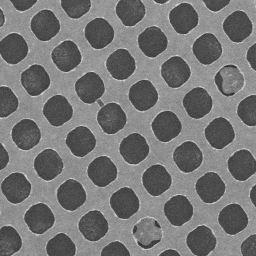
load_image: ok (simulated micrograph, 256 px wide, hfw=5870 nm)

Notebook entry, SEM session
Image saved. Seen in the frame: a regular array of holes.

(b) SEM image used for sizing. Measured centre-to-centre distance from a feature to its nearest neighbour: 869 nanometers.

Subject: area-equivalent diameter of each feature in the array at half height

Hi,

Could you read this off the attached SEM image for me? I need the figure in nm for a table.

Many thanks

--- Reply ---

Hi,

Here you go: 689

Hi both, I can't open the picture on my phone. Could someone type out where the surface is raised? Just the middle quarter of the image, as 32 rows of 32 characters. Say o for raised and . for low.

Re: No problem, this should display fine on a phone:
...oooooooo.......oooooo.......o
..ooooooooo.......oooooo........
ooooo...oooo.....ooooooo........
oooo.....ooo....ooooooooo......o
ooo.......oooooooo....ooo......o
ooo.......ooooooo.....oooo...ooo
ooo.......oooooo.......ooooooooo
ooo.......oooooo.......ooooooo..
oooo.....ooooooo........oooooo..
.oooo.....ooooooo......ooooooo..
..ooooooo.....ooo.....oooooooo..
..ooooooo......ooo...ooooooooo..
..oooooo.......oooooooo.....ooo.
..oooooo........ooooooo......ooo
.ooooooo........oooooo.......ooo
ooo.ooooo......ooooooo.......ooo
oo.....ooo....oooooooo.......ooo
o......oooo..oooo..ooo.......ooo
o.......ooooooo.....ooo.....oooo
........oooooo.......ooo..oooo..
o.......oooooo.......oooooooo...
o......ooooooo.......ooooooo....
oo....oooooooo.......oooooo.....
oooooooo...oooo......oooooo.....
ooooooo.....oooo...ooooooooo....
oooooo.......ooooooooo...ooo....
oooooo.......ooooooo......ooo...
oooooo.......ooooooo......oooooo
oooooo.......oooooo........ooooo
....ooo.....oooooooo.......ooooo
.....ooo...ooooooooo.......ooooo
.....ooooooooo...oooo.....oooooo